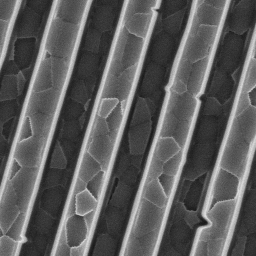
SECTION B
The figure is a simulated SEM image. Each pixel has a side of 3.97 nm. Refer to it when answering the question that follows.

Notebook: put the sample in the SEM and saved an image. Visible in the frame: one or a few lines or trenches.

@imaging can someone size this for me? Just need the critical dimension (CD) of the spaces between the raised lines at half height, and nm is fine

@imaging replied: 132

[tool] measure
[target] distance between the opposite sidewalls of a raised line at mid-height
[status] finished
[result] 132 nm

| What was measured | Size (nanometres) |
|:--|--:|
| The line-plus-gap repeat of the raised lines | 265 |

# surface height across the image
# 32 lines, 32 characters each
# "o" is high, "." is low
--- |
oo.....oooo.....oooo....ooooo...
oo....ooooo....oooo.....oooo....
oo....ooooo....oooo.....oooo....
o.....oooo.....oooo....ooooo....
o.....oooo.....oooo....oooo.....
o....ooooo....oooo.....oooo....o
o....oooo.....oooo....ooooo....o
.....oooo.....oooo....oooo.....o
....ooooo....ooooo....oooo.....o
....ooooo....oooo....ooooo....oo
....oooo.....oooo....ooooo....oo
....oooo....ooooo....oooo.....oo
...ooooo....oooo.....oooo....ooo
...oooo.....oooo....ooooo....ooo
...oooo....ooooo....ooooo....ooo
..ooooo....oooo.....oooo.....ooo
..ooooo....oooo.....oooo....oooo
..oooo.....oooo....ooooo....oooo
..oooo....ooooo....oooo.....oooo
.ooooo....oooo.....oooo....oooo.
.oooo.....oooo....ooooo....oooo.
.oooo....ooooo....oooo.....oooo.
ooooo....oooo.....oooo.....oooo.
ooooo....oooo....ooooo....oooo..
oooo.....oooo....ooooo....oooo..
oooo....ooooo....oooo.....oooo..
oooo....oooo.....oooo....ooooo..
ooo.....oooo....ooooo.....ooo...
ooo....ooooo....oooo.....oooo...
ooo....oooo.....oooo.....oooo...
ooo....oooo....ooooo....oooo....
oo.....oooo....ooooo....oooo....